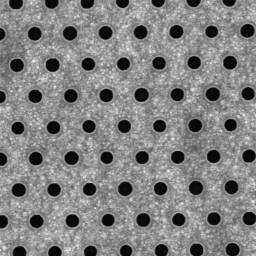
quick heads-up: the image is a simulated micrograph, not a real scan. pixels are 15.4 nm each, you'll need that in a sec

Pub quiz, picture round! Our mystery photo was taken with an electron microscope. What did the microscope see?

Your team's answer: a regular array of holes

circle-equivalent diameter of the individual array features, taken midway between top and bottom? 0.207 microns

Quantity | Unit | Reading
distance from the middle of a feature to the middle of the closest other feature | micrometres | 0.544